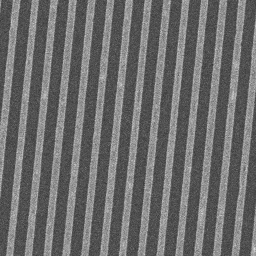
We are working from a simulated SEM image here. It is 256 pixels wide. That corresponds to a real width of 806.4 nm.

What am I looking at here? parallel lines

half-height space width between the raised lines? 37.2 nanometres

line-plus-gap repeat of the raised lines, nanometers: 59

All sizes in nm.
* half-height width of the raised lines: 22.7